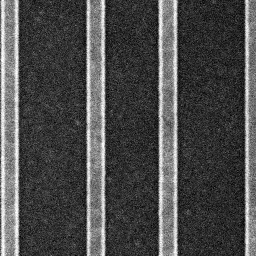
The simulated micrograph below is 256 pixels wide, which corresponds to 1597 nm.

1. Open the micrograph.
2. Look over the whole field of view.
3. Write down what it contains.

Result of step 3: one or a few lines or trenches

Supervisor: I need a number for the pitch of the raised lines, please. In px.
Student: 79.2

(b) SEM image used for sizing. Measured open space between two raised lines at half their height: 441 nm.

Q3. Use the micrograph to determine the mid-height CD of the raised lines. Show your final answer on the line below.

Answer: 92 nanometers